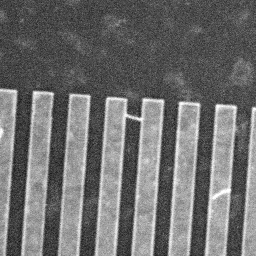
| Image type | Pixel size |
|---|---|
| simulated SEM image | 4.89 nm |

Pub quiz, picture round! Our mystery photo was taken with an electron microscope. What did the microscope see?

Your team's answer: parallel lines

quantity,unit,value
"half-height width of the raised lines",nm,92.1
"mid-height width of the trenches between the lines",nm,87.8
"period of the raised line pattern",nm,179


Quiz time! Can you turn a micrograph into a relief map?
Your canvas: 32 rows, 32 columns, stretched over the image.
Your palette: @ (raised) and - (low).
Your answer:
--------------------------------
--------------------------------
--------------------------------
--------------------------------
--------------------------------
--------------------------------
--------------------------------
--------------------------------
--------------------------------
--------------------------------
--------------------------------
@@------------------------------
@@--@@@--@@---@-----------------
@@--@@---@@--@@@--@@---@@--@@---
@@--@@---@@--@@@--@@--@@@--@@---
@@--@@---@@--@@---@@--@@@--@@---
@@--@@--@@@--@@---@@--@@@--@@--@
@@--@@--@@@--@@---@@--@@@--@@--@
@@--@@--@@@--@@---@@--@@---@@--@
@---@@--@@@--@@--@@@--@@---@@--@
@---@@--@@---@@--@@@--@@---@@--@
@---@@--@@---@@--@@@--@@---@@--@
@---@@--@@---@@--@@@--@@---@@--@
@--@@@--@@---@@--@@@--@@--@@@--@
@--@@@--@@---@@--@@---@@--@@@--@
@--@@@--@@--@@@--@@---@@--@@@--@
@--@@@--@@--@@@--@@---@@--@@@--@
@--@@---@@--@@@--@@---@@--@@---@
@--@@---@@--@@@--@@--@@@--@@---@
@--@@---@@--@@---@@--@@@--@@---@
@--@@--@@@--@@---@@--@@@--@@--@@
@--@@--@@@--@@---@@--@@@--@@--@@